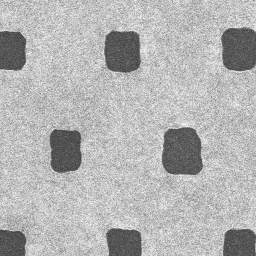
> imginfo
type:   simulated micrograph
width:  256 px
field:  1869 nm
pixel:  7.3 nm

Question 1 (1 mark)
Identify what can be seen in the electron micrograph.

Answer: holes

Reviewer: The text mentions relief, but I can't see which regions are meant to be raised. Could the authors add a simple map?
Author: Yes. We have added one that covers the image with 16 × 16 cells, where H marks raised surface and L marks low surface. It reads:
HHHHHHHHHHHHHHHH
HHHHHHHHHHHHHHHH
LLHHHHHLLHHHHHLL
LLHHHHHLLHHHHHLL
HHHHHHHHHHHHHHHH
HHHHHHHHHHHHHHHH
HHHHHHHHHHHHHHHH
HHHHHHHHHHHHHHHH
HHHLLHHHHHLLHHHH
HHHLLHHHHHLLLHHH
HHHLLHHHHHLLLHHH
HHHHHHHHHHHHHHHH
HHHHHHHHHHHHHHHH
HHHHHHHHHHHHHHHH
LHHHHHHLHHHHHHLL
LLHHHHHLLHHHHHLL